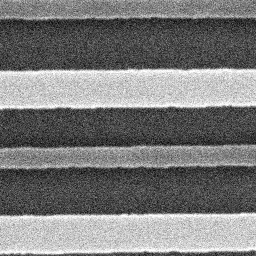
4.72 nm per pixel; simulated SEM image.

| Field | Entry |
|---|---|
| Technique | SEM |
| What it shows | lines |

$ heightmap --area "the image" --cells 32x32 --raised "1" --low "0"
11111111111111111111111111111111
11111111111111111111111111111111
00000000000000000000000000000000
00000000000000000000000000000000
00000000000000000000000000000000
00000000000000000000000000000000
00000000000000000000000000000000
00000000000000000000000000000000
00000000000000000000000000000000
11111111111111111111111111111111
11111111111111111111111111111111
11111111111111111111111111111111
11111111111111111111111111111111
10100000000000000000000000000000
00000000000000000000000000000000
00000000000000000000000000000000
00000000000000000000000000000000
00000000000000000000000000000000
00110001111111111111111111111111
11111111111111111111111111111111
11111111111111111111111111111111
00000000000000000000000000000000
00000000000000000000000000000000
00000000000000000000000000000000
00000000000000000000000000000000
00000000000000000000000000000000
00000000000000000000000000000000
11111111111111111111111111111111
11111111111111111111111111111111
11111111111111111111111111111111
11111111111111111111111111111111
11111111111111000000000000000000